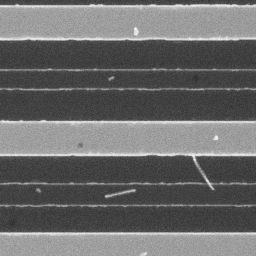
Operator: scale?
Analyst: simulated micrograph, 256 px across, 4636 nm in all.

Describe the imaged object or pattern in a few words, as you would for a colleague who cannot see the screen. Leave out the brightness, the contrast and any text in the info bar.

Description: lines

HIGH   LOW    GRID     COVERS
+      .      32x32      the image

................................
++++++++++++++++++++++++++++++++
++++++++++++++++++++++++++++++++
++++++++++++++++++++++++++++++++
++++++++++++++++++++++++++++++++
................................
................................
................................
................................
++++++++++++++++++++++++++++++++
++++++++++++++++++++++++++++++++
................................
................................
................................
................................
++++++++++++++++++++++++++++++++
++++++++++++++++++++++++++++++++
++++++++++++++++++++++++++++++++
++++++++++++++++++++++++++++++++
........................+.......
................................
................................
................................
++++++++++++++++++++++++++++++++
++++++++++++++++++++++++++++++++
++++++++++++++++++++++++++++++++
................................
................................
................................
++++++++++++++++++++++++++++++++
++++++++++++++++++++++++++++++++
++++++++++++++++++++++++++++++++